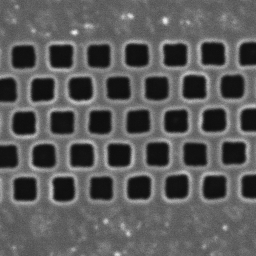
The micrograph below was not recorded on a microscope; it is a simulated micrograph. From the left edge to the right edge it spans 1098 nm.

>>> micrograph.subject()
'a regular array of holes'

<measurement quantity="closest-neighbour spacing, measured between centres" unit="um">0.162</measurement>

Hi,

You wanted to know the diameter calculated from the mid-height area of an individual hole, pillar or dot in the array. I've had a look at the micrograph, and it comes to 111 nm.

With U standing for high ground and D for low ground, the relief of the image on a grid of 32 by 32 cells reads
UUUUUUUUUUUUUUUUUUUUUUUUUUUUUUUU
UUUUUUUUUUUUUUUUUUUUUUUUUUUUUUUU
UUUUUUUUUUUUUUUUUUUUUUUUUUUUUUUU
UUUUUUUUUUUUUUUUUUUUUUUUUUUUUUUU
UUUUUUUUUUUUUUUUUUUUUUUUUUUUUUUU
UUUUUUUUUUUUUUUUDDUUUUUUUDDDUUDD
UDDDUUDDDUUDDDUUDDDUDDDUUDDDUUDD
UDDDUUDDDUUDDDUUDDDUUDDUUDDDUUDD
UUDUUUUDUUUUUUUUUUUUUUUUUUUUUUUU
UUUUUUUUUUUUUUUUUUUUUUUDDUUUDDUU
DDUUDDDUUDDDUDDDUUDDDUUDDDUUDDDU
DDUUDDDUUDDDUDDDUUDDDUUDDDUUDDUU
DDUUDDUUUDDUUUUDUUUDUUUUUUUUUUUU
UUUUUUUUUUUUUUUUUUUUUUUUUUUUUUUD
UUDDUUDDDUUDDDUUDDDUUDDDUDDDUUDD
UUDDUUDDDUUDDDUUDDDUUDDDUDDDUUDD
UUDDUUUDDUUDDDUUDDUUUDDUUUDUUUUU
UUUUUUUUUUUUUUUUUUUUUUUUUUUUUUUU
DDUUDDDUUDDDUDDDUUDDDUUDDDUUDDDU
DDUUDDDUUDDDUDDDUUDDDUUDDDUUDDDU
DDUUDDDUUDDDUDDDUUDDDUUDDDUUDDUU
UUUUUUUUUUUUUUUUUUUUUUUUUUUUUUUU
UUDDUUUDDUUDDDUUDDDUUDDDUDDDUUDD
UUDDDUUDDUUDDDUUDDDUUDDDUDDDUUDD
UUDDDUUDDUUDDDUUDDDUUDDUUUDDUUDD
UUUUUUUUUUUUUUUUUUUUUUUUUUUUUUUU
UUUUUUUUUUUUUUUUUUUUUUUUUUUUUUUU
UUUUUUUUUUUUUUUUUUUUUUUUUUUUUUUU
UUUUUUUUUUUUUUUUUUUUUUUUUUUUUUUU
UUUUUUUUUUUUUUUUUUUUUUUUUUUUUUUU
UUUUUUUUUUUUUUUUUUUUUUUUUUUUUUUU
UUUUUUUUUUUUUUUUUUUUUUUUUUUUUUUU